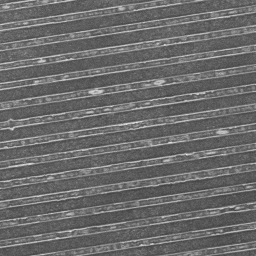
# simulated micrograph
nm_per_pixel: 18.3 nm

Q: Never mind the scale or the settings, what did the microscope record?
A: parallel lines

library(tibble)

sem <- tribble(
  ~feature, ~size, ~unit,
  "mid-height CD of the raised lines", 0.131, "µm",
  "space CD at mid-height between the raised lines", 12.7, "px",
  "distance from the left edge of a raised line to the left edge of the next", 357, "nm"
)